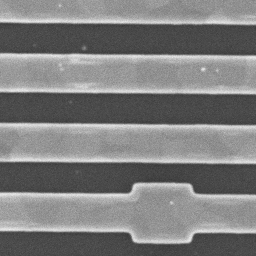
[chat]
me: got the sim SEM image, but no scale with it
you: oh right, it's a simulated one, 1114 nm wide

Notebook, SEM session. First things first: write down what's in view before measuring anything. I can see wiring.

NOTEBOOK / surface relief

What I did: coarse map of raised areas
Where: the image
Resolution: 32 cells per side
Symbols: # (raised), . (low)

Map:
################################
################################
################################
................................
................................
................................
................................
################################
################################
################################
################################
...........#####################
................................
................................
................................
###########.....................
################################
################################
################################
################################
................................
................................
................................
.................#######........
################################
################################
################################
################################
################################
................########........
................................
................................